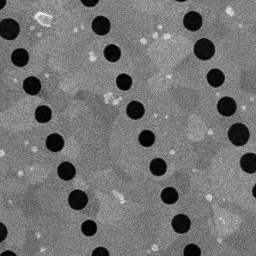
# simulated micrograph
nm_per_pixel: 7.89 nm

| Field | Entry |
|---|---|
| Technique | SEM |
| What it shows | a regular array of holes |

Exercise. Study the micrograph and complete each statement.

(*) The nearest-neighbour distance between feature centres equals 0.24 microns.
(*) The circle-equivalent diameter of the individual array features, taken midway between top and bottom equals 152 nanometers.